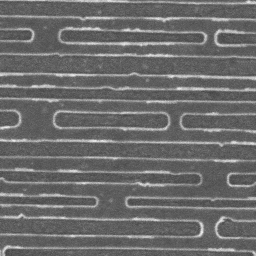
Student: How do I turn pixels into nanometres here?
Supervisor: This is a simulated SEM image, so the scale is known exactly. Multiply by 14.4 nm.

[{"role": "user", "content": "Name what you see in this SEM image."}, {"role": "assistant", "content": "parallel lines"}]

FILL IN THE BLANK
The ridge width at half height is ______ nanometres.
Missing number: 203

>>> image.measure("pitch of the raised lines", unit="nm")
391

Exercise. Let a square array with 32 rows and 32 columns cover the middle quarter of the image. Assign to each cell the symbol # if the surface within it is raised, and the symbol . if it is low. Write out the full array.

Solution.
................................
................................
.................#..............
################################
################################
################################
................................
................................
................................
################################
################################
################################
.........................######.
..........................###...
..........................###...
..........................####..
################################
################################
################################
..................##############
................................
................................
................................
#################...............
################################
################################
################################
...........................##...
................................
................................
################################
################################